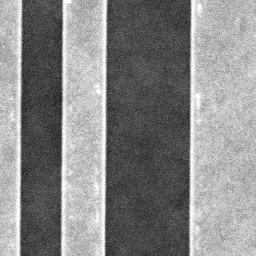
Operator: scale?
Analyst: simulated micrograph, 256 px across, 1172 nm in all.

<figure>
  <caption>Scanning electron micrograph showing wiring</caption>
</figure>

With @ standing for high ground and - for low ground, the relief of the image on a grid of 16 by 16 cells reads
@---@@@-----@@@@
@---@@@-----@@@@
@---@@@-----@@@@
@---@@@-----@@@@
@---@@@-----@@@@
@---@@@-----@@@@
@---@@@-----@@@@
@---@@@-----@@@@
@---@@@-----@@@@
@---@@@-----@@@@
@---@@@-----@@@@
@---@@@-----@@@@
@---@@@-----@@@@
@---@@------@@@@
@---@@------@@@@
@---@@------@@@@